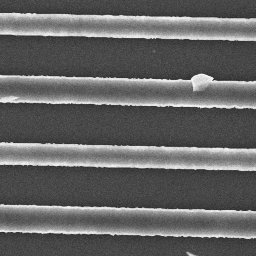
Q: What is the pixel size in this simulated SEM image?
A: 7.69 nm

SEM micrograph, lines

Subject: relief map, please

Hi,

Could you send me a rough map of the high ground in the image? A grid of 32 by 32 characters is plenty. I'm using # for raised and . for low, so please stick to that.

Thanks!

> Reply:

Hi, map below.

................................
................................
################################
################################
...........#####################
................................
................................
................................
................................
........................##......
################################
################################
################################
............................####
................................
................................
................................
................................
#######################.........
################################
################################
................................
................................
................................
................................
................................
################################
################################
################################
......................##########
................................
................................